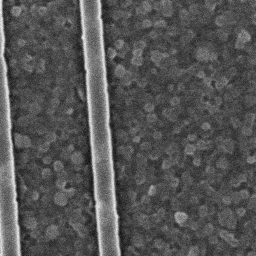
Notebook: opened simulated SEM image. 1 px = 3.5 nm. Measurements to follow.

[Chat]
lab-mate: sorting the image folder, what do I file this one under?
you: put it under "one or a few lines or trenches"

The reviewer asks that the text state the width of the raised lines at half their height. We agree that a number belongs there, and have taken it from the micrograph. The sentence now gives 0.0659 um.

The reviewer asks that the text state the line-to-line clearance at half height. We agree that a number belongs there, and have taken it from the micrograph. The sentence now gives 0.278 microns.